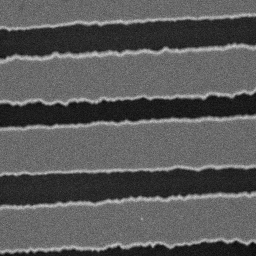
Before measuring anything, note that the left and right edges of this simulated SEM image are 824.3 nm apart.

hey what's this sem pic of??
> lines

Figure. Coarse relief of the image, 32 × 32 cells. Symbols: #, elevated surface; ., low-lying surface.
################################
################################
######################..........
#####...........................
................................
................................
...........#.###################
################################
################################
################################
################################
################################
################................
................................
.............................###
.........#######################
################################
################################
################################
################################
################################
##############..................
................................
................................
......................##########
.......#########################
################################
################################
################################
################################
########################......#.
####............................